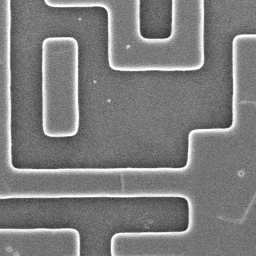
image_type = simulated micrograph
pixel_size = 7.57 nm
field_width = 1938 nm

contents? wiring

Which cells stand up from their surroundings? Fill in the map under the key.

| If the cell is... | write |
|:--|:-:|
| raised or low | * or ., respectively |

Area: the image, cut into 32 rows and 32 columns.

*.....***********.....***.......
*............****.....***.......
*.............***.....***.......
*.............***.....***.......
*.............****...****.....**
*....*****....***********....***
*....*****....***********....***
*....*****....***********....***
*....*****....***********....***
*....*****...................***
*....*****...................***
*....*****...................***
*....*****...................***
*....*****...................***
*....*****...................***
*....*****...................***
*.....***...............********
*.......................********
*.......................********
*.......................********
*......................*********
********************************
********************************
********************************
********************************
........................********
........................********
........................********
.......................*********
**********....******************
**********....******************
**********....******************